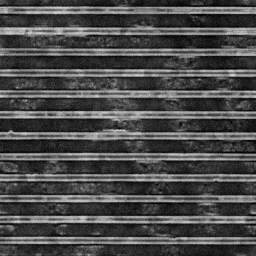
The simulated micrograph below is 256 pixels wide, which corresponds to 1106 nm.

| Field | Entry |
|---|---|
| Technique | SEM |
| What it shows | parallel lines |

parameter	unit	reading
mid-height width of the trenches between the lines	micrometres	0.0659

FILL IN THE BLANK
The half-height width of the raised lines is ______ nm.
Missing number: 22.1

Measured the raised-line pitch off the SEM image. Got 90.5 nm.